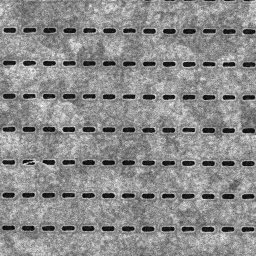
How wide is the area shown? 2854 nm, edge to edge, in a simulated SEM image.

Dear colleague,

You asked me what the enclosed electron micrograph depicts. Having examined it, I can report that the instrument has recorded a regular array of holes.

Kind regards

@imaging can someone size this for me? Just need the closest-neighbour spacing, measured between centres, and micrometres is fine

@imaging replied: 0.222